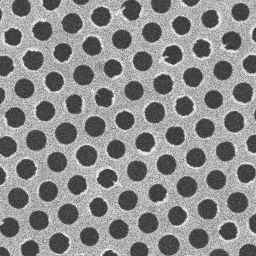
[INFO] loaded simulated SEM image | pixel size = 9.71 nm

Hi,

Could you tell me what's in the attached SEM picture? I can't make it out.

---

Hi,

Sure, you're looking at a regular array of holes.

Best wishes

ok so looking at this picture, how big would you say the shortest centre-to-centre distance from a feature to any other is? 291 nm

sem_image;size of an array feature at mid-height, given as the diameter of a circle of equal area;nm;192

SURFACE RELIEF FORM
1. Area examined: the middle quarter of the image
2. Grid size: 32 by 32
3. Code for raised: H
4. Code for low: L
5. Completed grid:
HHHHLLHHHHLLLLHHHHLLLLHHHHHHHHHH
HHHLLLLHHHLLLLLHHHHLLHHHHHHHHHHL
HHLLLLLHHHLLLLHHHHHHHHHHHHHHHHLL
HHLLLLLHHHHHHHHHHHHHHHHLLLLHHHLL
HHHLLLLHHHHHHHHHHLHHHHLLLLLHHHLL
HHHHHHHHHHHHHHHLLLLLHHLLLLLHHHHL
HHHHHHHHHLLHHHHLLLLLHHHLLLLHHHHH
HHHHHHHHLLLLHHHLLLLLHHHHLLHHHHHH
HLLLHHHHLLLLHHHHLLLHHHHHHHHHHLLH
LLLLLHHHLLLLHHHHHHHHHHLHHHHHLLLL
HLLLHHHHHLLHHHHHHHHHHLLLLHHHLLLL
HLLLHHHHHHHHHHHHHHHHLLLLLHHHLLLL
HHHHHHHHHHHHHLLLLHHHLLLLLHHHHLLL
HHHHHHLLLHHHHLLLLLHHLLLLLHHHHHHH
HHHHHLLLLLHHHLLLLLHHHLLLHHHHHHHH
LLLHHLLLLLHHHLLLLHHHHHHHHHHHHHHH
LLLHHLLLLLHHHHHLHHHHHHHHHHLLLLHH
LLLHHHLLLLHHHHHHHHHLLLHHHLLLLLHH
LLLHHHHHHHHHHHHHHHLLLLHHHLLLLLHH
LLHHHHHHHHHHLLHHHHLLLLLHHHLLLLHH
HHHHHLLHHHHLLLLHHHLLLLLHHHHHHHHH
HHHLLLLLHHHLLLLHHHHLLLHHHHHHHHHH
HHHLLLLLHHHLLLLHHHHHHHHHHHHHHHHL
LHHLLLLLHHHHLLHHHHHHHHHHLLLLHHLL
LHHHLLLLHHHHHHHHHLLLHHHLLLLLHHHL
LHHHHLHHHHHHHHHHLLLLLHHLLLLLHHHH
HHHHHHHHHHLLHHHHLLLLLHHHLLLLHHHH
HHHHHHHHHLLLLHHHLLLLLHHHHLLHHHHH
HHLLLHHHLLLLLHHHLLLLHHHHHHHHHLLL
HLLLLLHHLLLLLHHHHHHHHHHHHHHHHLLL
HLLLLLHHHLLLHHHHHHHHHHLLLHHHLLLL
HLLLLHHHHHHHHHHHHHHHHLLLLLHHLLLL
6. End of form